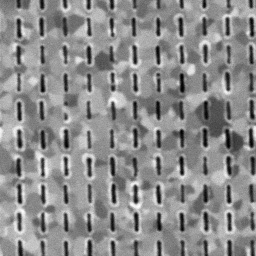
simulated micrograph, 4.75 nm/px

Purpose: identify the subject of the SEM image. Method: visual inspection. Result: a regular array of holes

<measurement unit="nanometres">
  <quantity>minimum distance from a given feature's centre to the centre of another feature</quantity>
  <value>109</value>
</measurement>